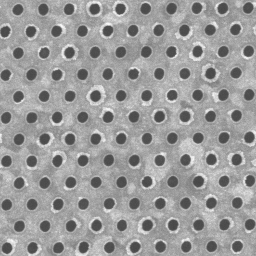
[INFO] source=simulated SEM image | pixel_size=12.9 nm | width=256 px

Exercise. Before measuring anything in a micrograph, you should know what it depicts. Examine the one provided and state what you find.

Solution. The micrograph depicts a regular array of holes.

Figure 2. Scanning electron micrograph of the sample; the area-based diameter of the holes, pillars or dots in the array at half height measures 11.3 pixels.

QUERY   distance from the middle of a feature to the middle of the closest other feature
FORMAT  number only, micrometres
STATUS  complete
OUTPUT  0.32